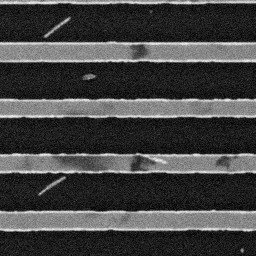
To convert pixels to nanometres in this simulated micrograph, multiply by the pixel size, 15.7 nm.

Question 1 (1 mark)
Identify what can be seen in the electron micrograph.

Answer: lines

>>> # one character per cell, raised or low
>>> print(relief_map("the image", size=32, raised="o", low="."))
................................
................................
................................
................................
................................
oooooooooooooooooooooooooooooooo
oooooooooooooooooooooooooooooooo
oooooooooooooooooooooooooooooooo
................................
................................
................................
................................
oo......ooo.oooo.oooo..oo...oooo
oooooooooooooooooooooooooooooooo
oooooooooooooooooooooooooooooooo
................................
................................
................................
................................
oooooooooooooooooooooooooooooooo
oooooooooooooooooooooooooooooooo
ooooooo.o..oo..oooo..ooooooooooo
................................
................................
................................
................................
...ooooooooo.oo..ooooooooooooooo
oooooooooooooooooooooooooooooooo
oooooooooooooooooooooooooooooooo
................................
................................
................................